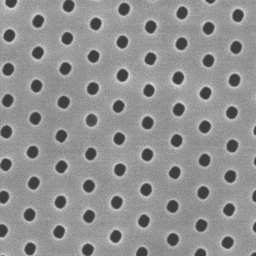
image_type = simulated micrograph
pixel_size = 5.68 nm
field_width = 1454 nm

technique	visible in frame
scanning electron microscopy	a regular array of holes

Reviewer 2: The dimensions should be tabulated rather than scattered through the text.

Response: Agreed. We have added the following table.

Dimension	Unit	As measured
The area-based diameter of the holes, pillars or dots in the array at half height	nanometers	68.7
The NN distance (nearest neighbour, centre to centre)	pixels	31.1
